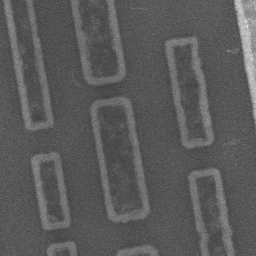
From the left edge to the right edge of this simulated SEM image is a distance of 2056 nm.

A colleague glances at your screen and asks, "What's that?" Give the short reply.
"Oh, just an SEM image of one or a few lines or trenches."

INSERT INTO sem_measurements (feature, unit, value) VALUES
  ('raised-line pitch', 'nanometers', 608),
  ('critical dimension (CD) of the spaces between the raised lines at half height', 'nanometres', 393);